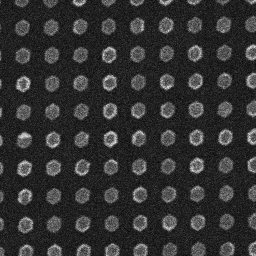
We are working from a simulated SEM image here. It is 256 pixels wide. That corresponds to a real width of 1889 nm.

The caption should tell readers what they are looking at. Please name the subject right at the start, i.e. a regular array of raised bodies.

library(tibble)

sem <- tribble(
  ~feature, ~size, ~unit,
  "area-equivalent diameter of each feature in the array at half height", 106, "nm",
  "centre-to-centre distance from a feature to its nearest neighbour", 206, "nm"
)